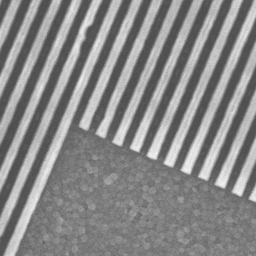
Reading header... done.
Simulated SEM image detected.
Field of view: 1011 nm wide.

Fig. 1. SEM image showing parallel lines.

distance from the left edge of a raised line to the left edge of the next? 73.2 nm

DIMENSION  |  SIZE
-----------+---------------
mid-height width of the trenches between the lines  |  36.8 nm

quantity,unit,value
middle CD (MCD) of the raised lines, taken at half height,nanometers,36.8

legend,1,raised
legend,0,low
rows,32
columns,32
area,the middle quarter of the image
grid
11100111001110011100111001110011
11000110001100011000110001100011
11001110011100111001110011100111
10001100011000110001110011000111
10011100111000110001100011000110
00011000111001110011100111001100
00011000110001100011000110001100
00111001110011100111001110011100
00110001100011000110001100011000
01110011100111001110011100011000
01100011000110001100011100111001
11100011000110001100011000110001
11100110001110011100111001110011
11000110001100011000110001100011
11001110011100111001110011100111
10001100011000110001100011000110
10000000111001110001100011000110
00000000110001100011100111001110
00000000000001100011000110001100
00000000000001100111001110011100
00000000000000000110001100011000
00000000000000000010011100111000
00000000000000000000011000110001
00000000000000000000001000110001
00000000000000000000000001110011
00000000000000000000000000000011
00000000000000000000000000000011
00000000000000000000000000000000
00000000000000000000000000000000
00000000000000000000000000000000
00000000000000000000000000000000
00000000000000000000000000000000